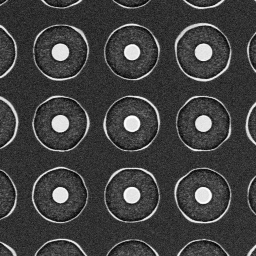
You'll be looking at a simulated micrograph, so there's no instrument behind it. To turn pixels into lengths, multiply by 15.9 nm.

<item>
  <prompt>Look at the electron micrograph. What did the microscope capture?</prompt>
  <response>an array of small figures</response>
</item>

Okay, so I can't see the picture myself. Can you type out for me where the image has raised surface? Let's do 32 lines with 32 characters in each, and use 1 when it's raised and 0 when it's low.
11111100011111100011111100011111
11111111111111111111111111111111
11111111111111111111111111111111
11111100011111100011111100011111
01111000001111000001111000001111
00110000000110000000110000000110
00110001000110001000110011000110
00110000000110000000110001000110
01111000001111000001111000001111
11111100011111100011111100011111
11111111111111111111111111111111
11111111111111111111111111111111
11111100011111100011111100011111
01111000001111000001111000001111
00110000000110000000110000000110
00110001000110001000110011000110
00110000000110000000110000000110
01111000001111000001111000001111
11111100011111100011111100011111
11111111111111111111111111111111
11111111111111111111111111111111
11111100011111100011111100011111
01111000001111000001111000001111
00110000000110000000110000000110
00110001000110001000110001000110
00110000000110000000110000000110
01111000001111000001111000001111
11111100011111100011111100011111
11111111111111111111111111111111
11111111111111111111111111111111
11111100011111100011111100011111
00111000001111000001111000001110